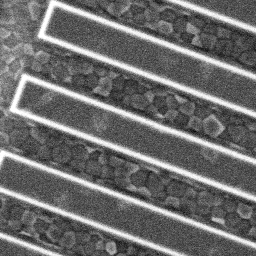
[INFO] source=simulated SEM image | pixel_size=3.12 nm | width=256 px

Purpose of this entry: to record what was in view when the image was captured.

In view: one or a few lines or trenches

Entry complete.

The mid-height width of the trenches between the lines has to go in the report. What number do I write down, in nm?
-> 132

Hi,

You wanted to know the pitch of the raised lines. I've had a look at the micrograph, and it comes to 245 nm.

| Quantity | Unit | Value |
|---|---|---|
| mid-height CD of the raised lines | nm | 114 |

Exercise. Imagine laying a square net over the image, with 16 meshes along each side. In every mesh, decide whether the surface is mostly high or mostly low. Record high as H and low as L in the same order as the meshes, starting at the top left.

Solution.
LLLHLLLLLLLLHHHH
LLLHHHHLLLLLLLLH
LLLHHHHHHHLLLLLL
LLLLLLHHHHHHLLLL
LLLLLLLLLHHHHHHL
LHHHLLLLLLLHHHHH
LHHHHHLLLLLLLLHH
LLHHHHHHHLLLLLLL
LLLLLHHHHHHHLLLL
LLLLLLLLHHHHHHLL
HHHLLLLLLLLHHHHH
HHHHHHLLLLLLLHHH
LLHHHHHHLLLLLLLL
LLLLHHHHHHHLLLLL
LLLLLLLHHHHHHHLL
HHLLLLLLLLHHHHHH